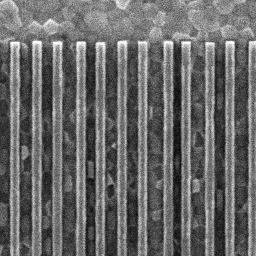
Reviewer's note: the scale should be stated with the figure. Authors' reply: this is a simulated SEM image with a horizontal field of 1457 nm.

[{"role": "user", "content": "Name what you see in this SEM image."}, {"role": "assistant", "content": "parallel lines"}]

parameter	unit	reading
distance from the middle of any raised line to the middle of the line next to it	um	0.122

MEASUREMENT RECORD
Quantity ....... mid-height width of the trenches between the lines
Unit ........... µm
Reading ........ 0.0719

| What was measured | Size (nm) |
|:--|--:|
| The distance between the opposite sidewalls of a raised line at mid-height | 47.7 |